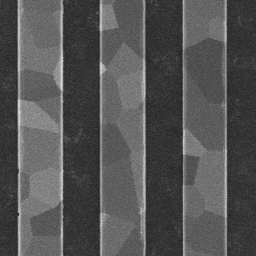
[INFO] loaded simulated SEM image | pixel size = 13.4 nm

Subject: one or a few lines or trenches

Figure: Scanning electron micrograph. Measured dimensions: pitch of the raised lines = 1100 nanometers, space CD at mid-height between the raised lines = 517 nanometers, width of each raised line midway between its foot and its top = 584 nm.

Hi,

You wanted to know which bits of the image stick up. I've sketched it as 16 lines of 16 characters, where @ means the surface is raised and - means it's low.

-@@@--@@@--@@@--
-@@@--@@@--@@@--
-@@@--@@@--@@@--
-@@@--@@@--@@@--
-@@@--@@@--@@@--
-@@@--@@@--@@@--
-@@@--@@@--@@@--
-@@@--@@@--@@@--
-@@@--@@@--@@@--
-@@@--@@@--@@@--
-@@@--@@@--@@@--
-@@@--@@@---@@--
-@@@--@@@---@@--
-@@@--@@@---@@--
-@@@--@@@---@@--
-@@@--@@@---@@--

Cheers